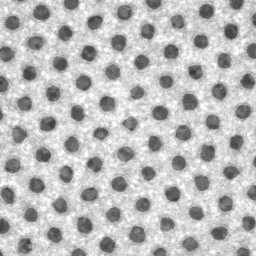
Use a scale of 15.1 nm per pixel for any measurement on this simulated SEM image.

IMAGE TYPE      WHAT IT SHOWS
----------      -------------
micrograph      a regular array of raised bodies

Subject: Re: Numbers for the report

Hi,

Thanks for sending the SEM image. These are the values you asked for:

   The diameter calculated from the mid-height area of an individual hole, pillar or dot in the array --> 250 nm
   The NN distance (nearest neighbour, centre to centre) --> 257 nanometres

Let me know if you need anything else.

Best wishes